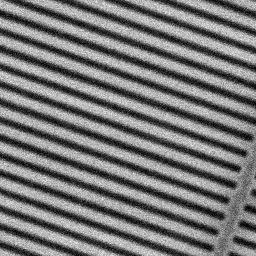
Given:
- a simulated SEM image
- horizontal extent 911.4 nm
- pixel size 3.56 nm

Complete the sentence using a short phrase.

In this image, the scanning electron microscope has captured parallel lines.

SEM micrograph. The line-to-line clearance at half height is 30.2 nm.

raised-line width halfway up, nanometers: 30.2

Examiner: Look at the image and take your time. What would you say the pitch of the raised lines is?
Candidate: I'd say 59.6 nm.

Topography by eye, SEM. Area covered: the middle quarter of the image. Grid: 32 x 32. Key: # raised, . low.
######......######.......#####..
..######.......######......#####
.....######.......#####.......##
#.......######......######......
####.......######......######...
.######......#######......######
....######......######.......###
......#######......######.......
###......#######......######....
######......######.......######.
..#######......######......#####
.....######.......######......##
##......######......#######.....
####.......######......#######..
.######.......######......######
....######......#######......###
.......######......######.......
###......#######......######....
######......######.......######.
..#######......######.......####
.....######.......######......##
##......######.......######.....
#####......######......#######..
..######......######......######
....#######.....#######......###
#......######......######.......
####......######......######....
#######......######......######.
...######.......######......####
......######......#######.....##
##.......######......#######....
#####.......######......######..